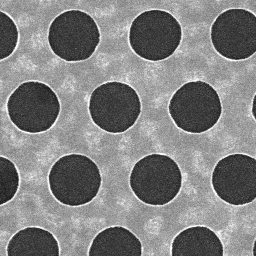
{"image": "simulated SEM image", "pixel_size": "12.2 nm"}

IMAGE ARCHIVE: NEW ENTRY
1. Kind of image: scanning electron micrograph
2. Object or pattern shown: holes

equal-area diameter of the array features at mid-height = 52.4 px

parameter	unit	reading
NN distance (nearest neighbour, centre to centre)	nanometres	989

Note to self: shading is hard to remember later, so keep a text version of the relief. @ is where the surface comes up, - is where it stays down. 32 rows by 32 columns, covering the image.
@@@@@@@@@@@@@@@@@@@@@@@@@@@@@@@@
@@@@@@@@---@@@@@@@---@@@@@@@---@
--@@@@@-----@@@@@-----@@@@@-----
--@@@@------@@@@-------@@@------
--@@@@------@@@@-------@@@------
--@@@@------@@@@------@@@@@-----
--@@@@@-----@@@@@-----@@@@@-----
@@@@@@@@--@@@@@@@@--@@@@@@@@@@@@
@@@@@@@@@@@@@@@@@@@@@@@@@@@@@@@@
@@@@@@@@@@@@@@@@@@@@@@@@@@@@@@@@
@@@---@@@@@@@---@@@@@@@---@@@@@@
@@-----@@@@@-----@@@@@-----@@@@@
@------@@@@-------@@@-------@@@@
@-------@@@-------@@@-------@@@-
@------@@@@------@@@@-------@@@@
@@-----@@@@@-----@@@@@-----@@@@@
@@@--@@@@@@@@@-@@@@@@@@---@@@@@@
@@@@@@@@@@@@@@@@@@@@@@@@@@@@@@@@
@@@@@@@@@@@@@@@@@@@@@@@@@@@@@@@@
@@@@@@@@---@@@@@@@---@@@@@@@---@
--@@@@@-----@@@@@-----@@@@@-----
--@@@@------@@@@-------@@@@-----
--@@@@-------@@@-------@@@------
--@@@@------@@@@-------@@@@-----
--@@@@@-----@@@@@-----@@@@@-----
-@@@@@@@---@@@@@@@---@@@@@@@@--@
@@@@@@@@@@@@@@@@@@@@@@@@@@@@@@@@
@@@@@@@@@@@@@@@@@@@@@@@@@@@@@@@@
@@@--@@@@@@@@---@@@@@@@---@@@@@@
@@-----@@@@@-----@@@@@-----@@@@@
@------@@@@-------@@@@------@@@@
@------@@@@-------@@@-------@@@@